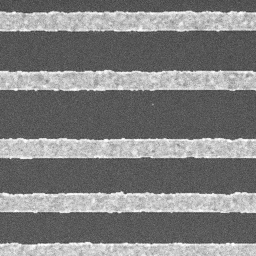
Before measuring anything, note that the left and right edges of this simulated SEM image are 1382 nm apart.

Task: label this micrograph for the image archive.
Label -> lines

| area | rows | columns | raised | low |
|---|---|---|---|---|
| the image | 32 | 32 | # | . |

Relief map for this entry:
................................
................................
################################
################################
................................
................................
................................
................................
................................
################################
################################
................................
................................
................................
................................
................................
................................
###.#######..##########.########
################################
################################
................................
................................
................................
................................
################################
################################
....#..##....###.....#.....##.#.
................................
................................
................................
.#.......###....................
################################